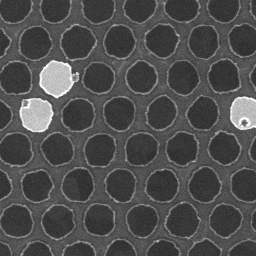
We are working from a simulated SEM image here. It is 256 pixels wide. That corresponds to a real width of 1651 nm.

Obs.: a regular array of raised bodies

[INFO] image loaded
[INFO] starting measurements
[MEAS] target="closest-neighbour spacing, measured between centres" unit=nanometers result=264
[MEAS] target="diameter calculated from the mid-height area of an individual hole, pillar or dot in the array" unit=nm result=216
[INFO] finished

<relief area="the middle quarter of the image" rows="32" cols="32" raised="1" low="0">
10000011111000000111110000011111
11000111111100001111111000111111
11010111111100001111111000111111
11110111111110001111111000111111
11100111111110001111111000111111
11000111111100001111110000111111
10000011111000000111110000011111
00000000000000000000000000001111
00000000000011110000000111000000
01111100000111111000001111110000
11111110001111111100011111110000
11111110001111111100011111110001
11111111001111111100011111110001
11111111001111111100011111110001
11111110001111111000011111100001
11111110000111111000001111000000
01111000000001110000000100000000
00000000111000000011100000001111
10000011111100001111111000011111
11000011111110001111111100111111
11000111111110011111111101111111
11100111111110011111111101111111
11100111111110011111111000111111
11000111111100001111111000111111
10000011111100001111110000011110
00000001111000000111000000000000
00111100000001110000000111100000
01111110000111111000001111110000
11111110000111111100011111110000
11111110001111111100011111111001
11111111001111111100111111111001
11111110001111111100111111111001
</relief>